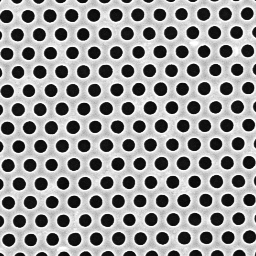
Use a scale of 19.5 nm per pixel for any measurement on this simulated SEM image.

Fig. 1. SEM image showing a regular array of holes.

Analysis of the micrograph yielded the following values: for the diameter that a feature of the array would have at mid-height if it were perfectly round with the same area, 261 nm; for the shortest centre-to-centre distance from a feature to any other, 414 nm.